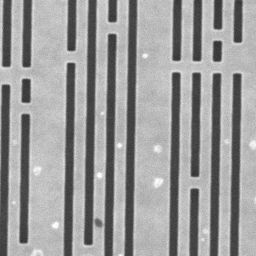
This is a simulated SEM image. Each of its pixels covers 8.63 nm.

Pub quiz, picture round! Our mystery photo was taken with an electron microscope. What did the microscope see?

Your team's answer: groups of lines, slits or small figures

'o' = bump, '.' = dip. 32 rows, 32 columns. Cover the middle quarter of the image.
o..ooo..ooo..ooo..oooooooooooooo
o..ooo..ooo..ooo..oooooooooooooo
o..ooo..ooo..ooo..ooooooooo..ooo
...ooo..ooo..ooo..ooooooooo..ooo
...ooo..ooo..ooo..ooooooooo..ooo
...ooo..ooo..ooo..ooooooooo..ooo
...ooo..ooo..ooo..ooooooooo..ooo
...ooo..ooo..ooo..ooooooooo..ooo
...ooo..oo...ooo..ooooooooo..ooo
...ooo..oo...ooo..ooooooooo..ooo
...ooo..oo...ooo..ooooooooo..ooo
...ooo..oo...ooo..ooooooooo..ooo
...ooo..oo...ooo..ooooooooo..ooo
...ooo..oo...ooo..ooooooooo..ooo
...ooo..oo...ooo..ooooooooo..ooo
...oo...oo...ooo..ooooooooo..ooo
...oo...oo...ooo..ooooooooo..ooo
...oo...oo...ooo..ooooooooo..ooo
...oo...oo...ooo..ooooooooo..ooo
...oo...oo...ooo..ooooooooo..ooo
...oo...oo...oo...ooooooooo..ooo
...oo...oo...oo...ooooooooo..ooo
...oo...oo...oo...ooooooooo..ooo
...oo...oo...oo...ooooooooo..ooo
...oo...oo...oo...ooooooooo..oo.
...oo...oo...oo...oooooooo...oo.
...oo...oo...oo...oooooooo...oo.
...oo...oo...oo...oooooooo...oo.
...oo...oo...oo...oooooooo...ooo
..ooo...oo...oo...oooooooo...ooo
...oo...oo...oo...oooooooo...ooo
..ooo...oo...oo...oooooooo...ooo